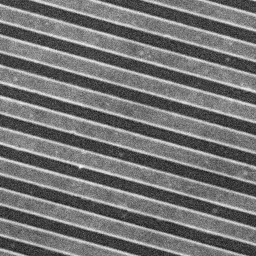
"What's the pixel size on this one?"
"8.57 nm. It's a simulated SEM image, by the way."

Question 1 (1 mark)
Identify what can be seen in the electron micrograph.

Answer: parallel lines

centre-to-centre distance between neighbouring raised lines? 252 nm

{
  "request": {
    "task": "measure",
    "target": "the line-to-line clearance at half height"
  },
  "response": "0.114 um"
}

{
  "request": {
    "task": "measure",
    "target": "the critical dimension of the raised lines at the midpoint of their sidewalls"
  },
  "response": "140 nanometers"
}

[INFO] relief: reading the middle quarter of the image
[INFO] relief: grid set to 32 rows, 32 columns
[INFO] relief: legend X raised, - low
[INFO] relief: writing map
XXXXXXXXXXX-------------XXXXXXXX
-XXXXXXXXXXXXXX-------------XXXX
----XXXXXXXXXXXXXXX-------------
-------XXXXXXXXXXXXXXXX---------
-----------XXXXXXXXXXXXXXXX-----
XX-------------XXXXXXXXXXXXXXX--
XXXXXX-------------XXXXXXXXXXXXX
XXXXXXXXXX------------XXXXXXXXXX
XXXXXXXXXXXXXX------------XXXXXX
-XXXXXXXXXXXXXXXX-------------XX
-----XXXXXXXXXXXXXXXX-----------
---------XXXXXXXXXXXXXXXX-------
------------XXXXXXXXXXXXXXXX----
XXXX------------XXXXXXXXXXXXXXXX
XXXXXXX------------XXXXXXXXXXXXX
XXXXXXXXXXX------------XXXXXXXXX
XXXXXXXXXXXXXX-------------XXXXX
---XXXXXXXXXXXXXXX------------XX
------XXXXXXXXXXXXXXXX----------
----------XXXXXXXXXXXXXXX-------
X-------------XXXXXXXXXXXXXXX---
XXXXX------------XXXXXXXXXXXXXXX
XXXXXXXXX------------XXXXXXXXXXX
XXXXXXXXXXXX------------XXXXXXXX
-XXXXXXXXXXXXXXX------------XXXX
----XXXXXXXXXXXXXXXX------------
--------XXXXXXXXXXXXXXX---------
-----------XXXXXXXXXXXXXXXX-----
XX-------------XXXXXXXXXXXXXXX--
XXXXXX-------------XXXXXXXXXXXXX
XXXXXXXXX-------------XXXXXXXXXX
XXXXXXXXXXXXX-------------XXXXXX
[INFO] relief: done